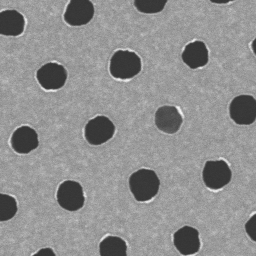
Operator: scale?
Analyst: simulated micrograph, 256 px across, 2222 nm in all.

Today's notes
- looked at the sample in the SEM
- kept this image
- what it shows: a regular array of holes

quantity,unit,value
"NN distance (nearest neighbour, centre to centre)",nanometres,601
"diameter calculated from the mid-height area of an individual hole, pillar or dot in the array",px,29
